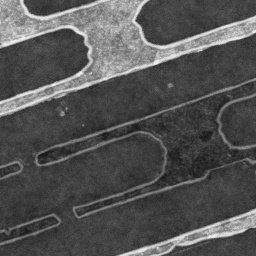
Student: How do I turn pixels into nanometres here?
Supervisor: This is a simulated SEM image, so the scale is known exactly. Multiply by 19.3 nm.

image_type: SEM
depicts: one or a few lines or trenches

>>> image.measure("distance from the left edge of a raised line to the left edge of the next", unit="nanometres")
1200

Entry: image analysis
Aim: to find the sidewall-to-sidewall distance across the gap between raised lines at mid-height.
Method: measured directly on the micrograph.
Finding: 973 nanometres